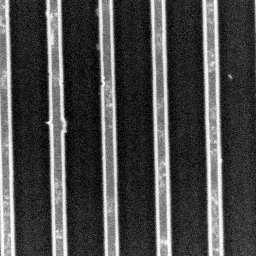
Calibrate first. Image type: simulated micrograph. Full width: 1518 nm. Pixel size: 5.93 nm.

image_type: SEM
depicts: parallel lines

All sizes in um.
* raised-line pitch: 0.308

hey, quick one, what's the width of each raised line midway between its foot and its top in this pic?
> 66.6 nm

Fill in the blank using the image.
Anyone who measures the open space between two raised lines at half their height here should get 40.7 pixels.